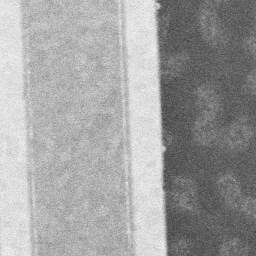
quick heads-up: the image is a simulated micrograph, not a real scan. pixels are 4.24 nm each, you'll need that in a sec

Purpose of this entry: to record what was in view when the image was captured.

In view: one or a few lines or trenches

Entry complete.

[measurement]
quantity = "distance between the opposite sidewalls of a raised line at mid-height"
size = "570 nanometers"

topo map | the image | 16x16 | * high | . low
*********.......
*********.......
*********.......
*********.......
.********.......
.********.......
.********.......
.********.......
.********.......
.********.......
.********.......
.********.......
.********.......
.********.......
.********.......
.********.......